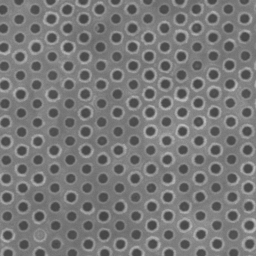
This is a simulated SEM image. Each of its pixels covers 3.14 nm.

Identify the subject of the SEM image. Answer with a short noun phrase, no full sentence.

a regular array of holes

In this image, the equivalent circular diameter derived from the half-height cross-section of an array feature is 0.0335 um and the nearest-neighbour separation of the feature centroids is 57.9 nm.